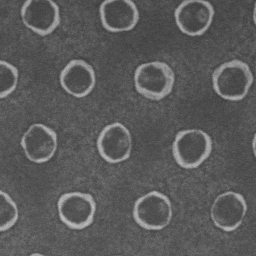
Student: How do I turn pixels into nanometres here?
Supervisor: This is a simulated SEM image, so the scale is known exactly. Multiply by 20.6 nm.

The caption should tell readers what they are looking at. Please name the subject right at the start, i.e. a regular array of raised bodies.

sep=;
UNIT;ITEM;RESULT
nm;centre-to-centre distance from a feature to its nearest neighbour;1530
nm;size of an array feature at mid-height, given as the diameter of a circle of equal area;702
